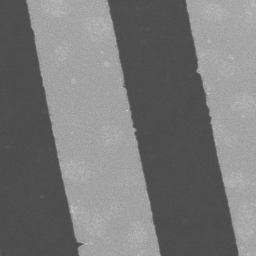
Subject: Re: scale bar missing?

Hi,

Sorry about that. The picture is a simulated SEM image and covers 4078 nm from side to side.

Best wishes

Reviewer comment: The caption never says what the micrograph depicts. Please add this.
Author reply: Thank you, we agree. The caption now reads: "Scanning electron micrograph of one or a few lines or trenches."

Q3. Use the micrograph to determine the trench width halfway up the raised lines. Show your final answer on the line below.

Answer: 1.24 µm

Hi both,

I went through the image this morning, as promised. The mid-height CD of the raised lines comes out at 1250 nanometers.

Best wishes